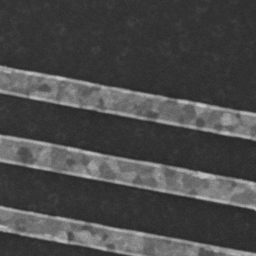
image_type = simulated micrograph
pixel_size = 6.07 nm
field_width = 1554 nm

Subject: one or a few lines or trenches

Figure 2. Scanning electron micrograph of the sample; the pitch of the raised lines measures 413 nm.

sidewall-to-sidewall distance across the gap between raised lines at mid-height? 0.271 um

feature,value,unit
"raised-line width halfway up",0.145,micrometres